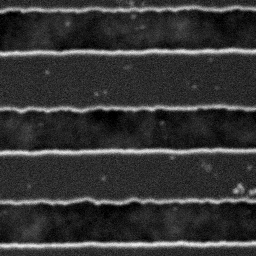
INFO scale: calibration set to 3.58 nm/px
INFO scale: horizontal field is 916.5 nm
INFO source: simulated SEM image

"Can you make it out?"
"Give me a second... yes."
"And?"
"lines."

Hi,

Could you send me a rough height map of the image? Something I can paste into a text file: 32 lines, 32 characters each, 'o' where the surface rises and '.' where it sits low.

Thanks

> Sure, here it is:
oooooooooooooooooooooooooooooooo
................................
................................
................................
................................
................................
....ooo.oooooooooooooooooooooooo
oooooooooooooooooooooooooooooooo
oooooooooooooooooooooooooooooooo
oooooooooooooooooooooooooooooooo
oooooooooooooooooooooooooooooooo
oooooooooooooooooooooooooooooooo
oooooooooooooooooooooooooooooooo
oooooooooooooooooooooooooo..oooo
................................
................................
................................
................................
................................
oooooooooooooooooooooooooooooooo
oooooooooooooooooooooooooooooooo
oooooooooooooooooooooooooooooooo
oooooooooooooooooooooooooooooooo
oooooooooooooooooooooooooooooooo
oooooooooooooooooooooooooooooooo
................................
................................
................................
................................
................................
..........oooooooooooooooooooooo
oooooooooooooooooooooooooooooooo